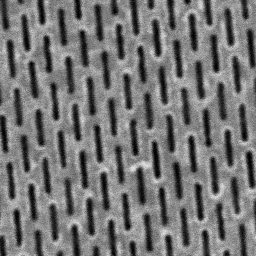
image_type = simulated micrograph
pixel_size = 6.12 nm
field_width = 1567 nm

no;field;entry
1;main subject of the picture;a regular array of holes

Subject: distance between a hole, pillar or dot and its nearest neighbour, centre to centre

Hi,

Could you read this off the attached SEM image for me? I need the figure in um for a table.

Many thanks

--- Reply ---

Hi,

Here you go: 0.182